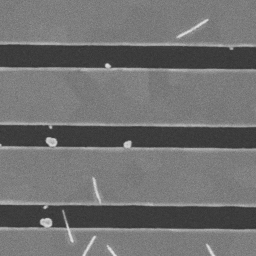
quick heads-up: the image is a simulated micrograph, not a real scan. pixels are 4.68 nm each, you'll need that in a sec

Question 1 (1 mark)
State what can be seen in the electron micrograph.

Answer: wiring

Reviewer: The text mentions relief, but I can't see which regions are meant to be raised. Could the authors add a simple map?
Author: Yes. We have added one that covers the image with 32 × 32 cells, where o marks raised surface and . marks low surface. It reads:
oooooooooooooooooooooooooooooooo
oooooooooooooooooooooooooooooooo
oooooooooooooooooooooooooooooooo
oooooooooooooooooooooooooooooooo
oooooooooooooooooooooooooooooooo
o.oooooooooooooooooooooooooooooo
................................
................................
oooo.ooooo...o..................
oooooooooooooooooooooooooooooooo
oooooooooooooooooooooooooooooooo
oooooooooooooooooooooooooooooooo
oooooooooooooooooooooooooooooooo
oooooooooooooooooooooooooooooooo
oooooooooooooooooooooooooooooooo
oooooooooooooooooooooooooooooooo
................................
......o.........................
oooooooooooooooooooooo..........
oooooooooooooooooooooooooooooooo
oooooooooooooooooooooooooooooooo
oooooooooooooooooooooooooooooooo
oooooooooooooooooooooooooooooooo
oooooooooooooooooooooooooooooooo
oooooooooooooooooooooooooooooooo
oooooooooooooooooooooooooooooooo
................................
.....o..........................
ooooooo.o.......................
oooooooooooooooooooooooooooooooo
oooooooooooooooooooooooooooooooo
oooooooooooooooooooooooooooooooo